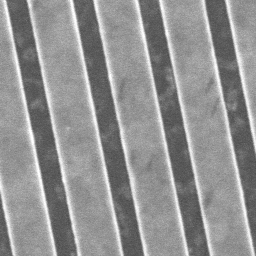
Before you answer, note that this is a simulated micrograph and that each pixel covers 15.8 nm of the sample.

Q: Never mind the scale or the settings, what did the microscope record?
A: one or a few lines or trenches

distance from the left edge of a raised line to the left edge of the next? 1020 nm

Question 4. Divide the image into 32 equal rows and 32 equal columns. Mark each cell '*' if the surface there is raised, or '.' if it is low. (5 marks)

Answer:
*...*****...*****...******..****
*...*****...*****...******...***
*...*****...******..******...***
*...******...*****...*****...***
**..******...*****...*****...***
**...*****...*****...*****...***
**...*****...*****...******...**
**...*****...******..******...**
**...******...*****...*****...**
***..******...*****...*****...**
***...*****...*****...*****...**
***...*****...*****...******...*
***...*****...******..******...*
***...******..******...*****...*
****..******...*****...*****...*
****...*****...*****...*****...*
****...*****...*****...******...
****...*****...******..******...
****...******..******...*****...
*****..******...*****...*****...
*****...*****...*****...*****...
*****...*****...*****...******..
*****...*****...****....******..
*****...******..******...*****..
******..******...*****...*****..
******...*****...*****...*****..
.*****...*****...*****...******.
.*****...*****...******..******.
.*****...******..******...*****.
.******..******...*****...*****.
.******...*****...*****...*****.
..*****...*****...*****...******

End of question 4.